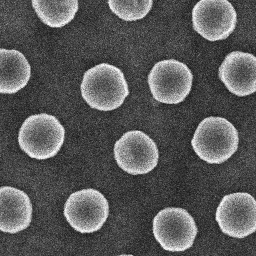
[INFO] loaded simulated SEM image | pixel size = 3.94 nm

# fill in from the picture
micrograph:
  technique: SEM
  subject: raised bodies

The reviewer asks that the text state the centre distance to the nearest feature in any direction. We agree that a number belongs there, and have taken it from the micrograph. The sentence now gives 0.288 microns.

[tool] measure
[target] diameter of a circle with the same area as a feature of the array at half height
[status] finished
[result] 43.9 pixels